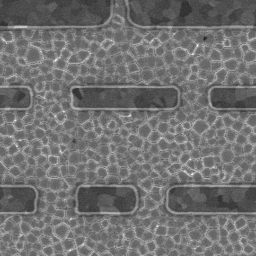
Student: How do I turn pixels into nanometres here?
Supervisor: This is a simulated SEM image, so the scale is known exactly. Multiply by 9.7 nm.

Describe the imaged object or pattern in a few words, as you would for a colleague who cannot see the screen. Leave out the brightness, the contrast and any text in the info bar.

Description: one or a few lines or trenches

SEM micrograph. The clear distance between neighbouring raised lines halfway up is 623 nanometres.